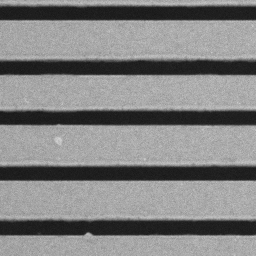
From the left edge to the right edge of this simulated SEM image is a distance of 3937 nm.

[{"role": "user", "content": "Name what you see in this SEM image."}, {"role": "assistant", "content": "lines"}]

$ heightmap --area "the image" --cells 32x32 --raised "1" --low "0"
11111111111111111111111111111111
00000000000000000000000000000000
00000000000000000000000000000000
11111111111111111111111111111111
11111111111111111111111111111111
11111111111111111111111111111111
11111111111111111111111111111111
00110000000000000000000000000000
00000000000000000000000000000000
11111111111111111111111111111111
11111111111111111111111111111111
11111111111111111111111111111111
11111111111111111111111111111111
11111111111111111111111111111111
00000000000000000000000000000000
00000000000000000000000000000000
11111111111111111111111111111111
11111111111111111111111111111111
11111111111111111111111111111111
11111111111111111111111111111111
11111111111111111111111111111111
00000000000000000000000000000000
00000000000000000000000000000000
11111111111111111111111111111111
11111111111111111111111111111111
11111111111111111111111111111111
11111111111111111111111111111111
11111101111110001110111111011111
00000000000000000000000000000000
00000000001100000000000000000000
11111111111111111111111111111111
11111111111111111111111111111111